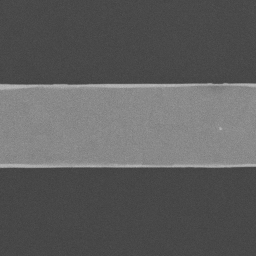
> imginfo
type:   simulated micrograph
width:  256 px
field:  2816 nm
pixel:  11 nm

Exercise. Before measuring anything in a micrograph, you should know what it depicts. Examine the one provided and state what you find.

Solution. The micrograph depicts wiring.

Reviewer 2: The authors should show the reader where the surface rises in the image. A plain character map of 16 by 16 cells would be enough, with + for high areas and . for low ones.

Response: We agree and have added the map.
................
................
................
................
................
++++++++++++++++
++++++++++++++++
++++++++++++++++
++++++++++++++++
++++++++++++++++
................
................
................
................
................
................